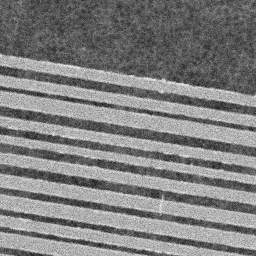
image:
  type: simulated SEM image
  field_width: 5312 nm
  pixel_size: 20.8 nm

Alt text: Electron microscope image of parallel lines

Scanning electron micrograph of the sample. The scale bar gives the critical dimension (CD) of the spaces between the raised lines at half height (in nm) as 182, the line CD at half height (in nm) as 218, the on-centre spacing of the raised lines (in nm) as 413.